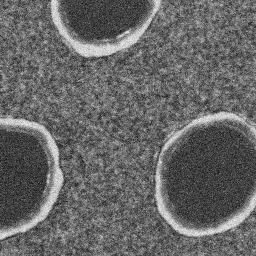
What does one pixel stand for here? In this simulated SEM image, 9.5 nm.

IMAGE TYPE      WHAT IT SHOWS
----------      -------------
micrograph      raised bodies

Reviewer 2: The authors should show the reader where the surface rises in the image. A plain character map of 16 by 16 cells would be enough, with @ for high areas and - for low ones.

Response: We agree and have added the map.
---@@@@@@@------
----@@@@@-------
----@@@@--------
----------------
----------------
----------------
----------------
------------@@@-
@@@--------@@@@@
@@@-------@@@@@@
@@@@------@@@@@@
@@@@------@@@@@@
@@@-------@@@@@@
@@@-------@@@@@-
@----------@@@--
----------------